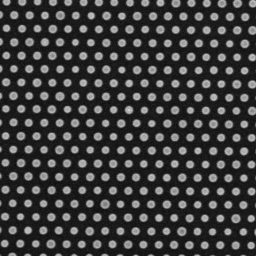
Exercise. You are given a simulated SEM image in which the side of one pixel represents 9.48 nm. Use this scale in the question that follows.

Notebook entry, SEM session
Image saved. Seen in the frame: a regular array of raised bodies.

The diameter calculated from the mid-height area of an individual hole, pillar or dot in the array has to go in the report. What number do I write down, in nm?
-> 68.5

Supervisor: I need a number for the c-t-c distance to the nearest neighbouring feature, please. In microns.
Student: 0.143